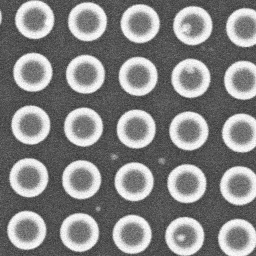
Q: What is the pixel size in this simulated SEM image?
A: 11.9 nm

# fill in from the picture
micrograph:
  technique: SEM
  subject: an array of small figures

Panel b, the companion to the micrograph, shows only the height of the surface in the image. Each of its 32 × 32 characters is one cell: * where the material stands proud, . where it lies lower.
...***....**....................
..****...****...***...****...***
..*****..****..*****..****...***
..****...****..*****..****..****
...***...***....***...****...***
.......................**....***
................................
..****...***....**.....*........
..****..*****..****...****...***
..****..*****..*****..****..****
..****...****..****...****..****
..........**....***...***....***
................................
...**...........................
..****..****...****...***....**.
.*****..*****..****..*****..****
..****..*****..****..*****..****
..***....***...****...****..****
.......................**....***
................................
..***....**.....**..............
.*****..****...****..****...****
.*****..*****.*****..*****..****
..****..****...****..*****..****
...*.....**....***....***...****
.............................*..
...*............................
.****...****...***....**.....*..
.*****..****..*****..****...****
.*****..****..*****..****..*****
..***...****...****..****..*****
................*.....**....***.